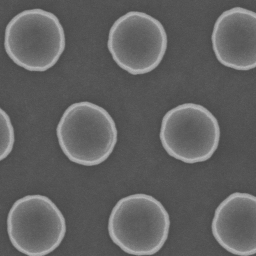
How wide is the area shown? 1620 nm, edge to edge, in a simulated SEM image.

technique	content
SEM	raised bodies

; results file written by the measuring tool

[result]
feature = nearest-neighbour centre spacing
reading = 654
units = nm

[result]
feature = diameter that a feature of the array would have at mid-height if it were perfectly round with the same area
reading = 366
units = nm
